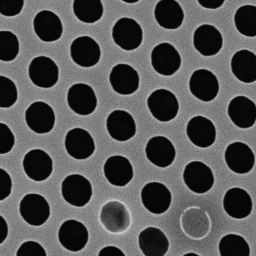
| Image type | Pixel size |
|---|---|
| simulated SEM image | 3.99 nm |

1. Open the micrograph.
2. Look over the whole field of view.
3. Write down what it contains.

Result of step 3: a regular array of holes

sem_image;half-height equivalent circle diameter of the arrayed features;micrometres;0.124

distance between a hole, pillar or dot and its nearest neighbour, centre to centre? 181 nanometres